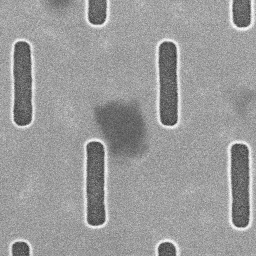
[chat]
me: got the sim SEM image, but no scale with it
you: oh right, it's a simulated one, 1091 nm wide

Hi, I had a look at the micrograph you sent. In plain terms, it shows holes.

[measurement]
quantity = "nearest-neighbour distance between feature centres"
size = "527 nm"